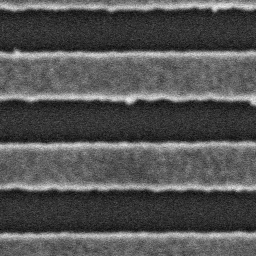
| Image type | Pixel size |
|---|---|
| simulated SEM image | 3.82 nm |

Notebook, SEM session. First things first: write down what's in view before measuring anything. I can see lines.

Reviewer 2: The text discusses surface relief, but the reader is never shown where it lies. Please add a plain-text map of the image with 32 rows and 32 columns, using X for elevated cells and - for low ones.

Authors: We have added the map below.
XXXXXXXXXXXXXXXXXXXXXXXXXXXXXXXX
--------------------------------
--------------------------------
--------------------------------
--------------------------------
--------------------------------
-------------------------------X
XXXXXXXXXXXXXXXXXXXXXXXXXXXXXXXX
XXXXXXXXXXXXXXXXXXXXXXXXXXXXXXXX
XXXXXXXXXXXXXXXXXXXXXXXXXXXXXXXX
XXXXXXXXXXXXXXXXXXXXXXXXXXXXXXXX
XXXXXXXXXXXXXXXXXXXXXXXXXXXXXXXX
----------------------X---------
--------------------------------
--------------------------------
--------------------------------
--------------------------------
--------------------------------
XXXXXXXXXXXXXXXXXXXXXXXXXXXXXXXX
XXXXXXXXXXXXXXXXXXXXXXXXXXXXXXXX
XXXXXXXXXXXXXXXXXXXXXXXXXXXXXXXX
XXXXXXXXXXXXXXXXXXXXXXXXXXXXXXXX
XXXXXXXXXXXXXXXXXXXXXXXXXXXXXXXX
XXXXXXXXXXXXXXXXXXXXXXXXXXXXXXXX
--------------------------------
--------------------------------
--------------------------------
--------------------------------
--------------------------------
XXXXXXXXXXXXXXXXXXXXXXXXXXXXXXXX
XXXXXXXXXXXXXXXXXXXXXXXXXXXXXXXX
XXXXXXXXXXXXXXXXXXXXXXXXXXXXXXXX